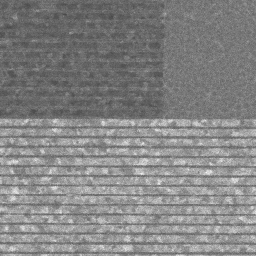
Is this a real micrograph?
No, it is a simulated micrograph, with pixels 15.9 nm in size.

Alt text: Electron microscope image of parallel lines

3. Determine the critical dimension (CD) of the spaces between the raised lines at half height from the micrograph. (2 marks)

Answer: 0.0458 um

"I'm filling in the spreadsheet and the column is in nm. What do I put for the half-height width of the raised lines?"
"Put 108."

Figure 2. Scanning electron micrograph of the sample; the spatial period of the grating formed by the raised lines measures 9.67 pixels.